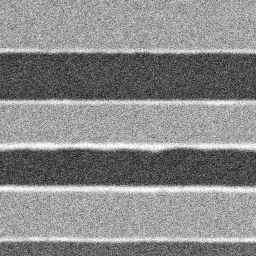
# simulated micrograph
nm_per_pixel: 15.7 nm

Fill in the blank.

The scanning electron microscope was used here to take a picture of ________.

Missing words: lines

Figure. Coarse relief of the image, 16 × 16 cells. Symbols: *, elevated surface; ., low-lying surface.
****************
****************
****************
................
................
................
****************
****************
****************
................
................
................
****************
****************
****************
................